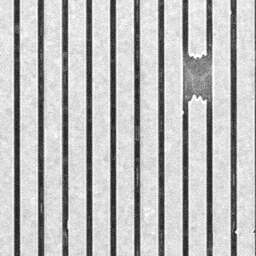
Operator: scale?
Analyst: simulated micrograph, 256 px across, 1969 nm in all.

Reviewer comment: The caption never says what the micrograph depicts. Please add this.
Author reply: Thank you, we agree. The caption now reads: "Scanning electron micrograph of parallel lines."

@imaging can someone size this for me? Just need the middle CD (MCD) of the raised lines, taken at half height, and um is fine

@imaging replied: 0.136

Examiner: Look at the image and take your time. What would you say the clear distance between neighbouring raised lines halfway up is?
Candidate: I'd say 53.8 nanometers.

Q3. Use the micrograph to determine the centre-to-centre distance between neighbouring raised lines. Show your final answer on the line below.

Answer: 185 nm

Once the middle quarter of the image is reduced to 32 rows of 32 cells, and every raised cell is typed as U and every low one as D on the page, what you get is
DUUUUDDUUUUDDUUUUDDUUUUDDUUUUDDD
DUUUUDDUUUUDDUUUUDDUUUUDDUUUUDDD
DUUUUDDUUUUDDUUUUDDUUUUDDUUUUDDD
DUUUUDDUUUUDDUUUUDDUUUUDDUUUUDDD
DUUUUDDUUUUDDUUUUDDUUUUDDUUUUDDD
DUUUUDDUUUUDDUUUUDDUUUUDDUUUUDDD
DUUUUDDUUUUDDUUUUDDUUUUDDUUUUDDD
DUUUUDDUUUUDDUUUUDDUUUUDDUUUUDDD
DUUUUDDUUUUDDUUUUDDUUUUDDUUUUDDD
DUUUUDDUUUUDDUUUUDDUUUUDDUUUUDDD
DUUUUDDUUUUDDUUUUDDUUUUDDUUUUDDU
DUUUUDDUUUUDDUUUUDDUUUUDDUUUUUDU
DUUUUDDUUUUDDUUUUDDUUUUDDUUUUUDU
DUUUUDDUUUUDDUUUUDDUUUUDDUUUUDDU
DUUUUDDUUUUDDUUUUDDUUUUDDUUUUDDU
DUUUUDDUUUUDDUUUUDDUUUUDDUUUUDDU
DUUUUDDUUUUDDUUUUDDUUUUDDUUUUDDU
DUUUUDDUUUUDDUUUUDDUUUUDDUUUUDDU
DUUUUDDUUUUDDUUUUDDUUUUDDUUUUDDU
DUUUUDDUUUUDDUUUUDDUUUUDDUUUUDDU
DUUUUDDUUUUDDUUUUDDUUUUDDUUUUDDU
DUUUUDDUUUUDDUUUUDDUUUUDDUUUUDDU
DUUUUDDUUUUDDUUUUDDUUUUDDUUUUDDU
DUUUUDDUUUUDDUUUUDDUUUUDDUUUUDDU
DUUUUDDUUUUDDUUUUDDUUUUDDUUUUDDU
DUUUUDDUUUUDDUUUUDDUUUUDDUUUUDDU
DUUUUDDUUUUDDUUUUDDUUUUDDUUUUDDU
DUUUUDDUUUUDDUUUUDDUUUUDDUUUUDDU
DUUUUDDUUUUDDUUUUDDUUUUDDUUUUDDU
DUUUUDDUUUUDDUUUUDDUUUUDDUUUUDDU
DUUUUDDUUUUDDUUUUDDUUUUDDUUUUDDU
DUUUUDDUUUUDDUUUUDDUUUUDDUUUUDDU